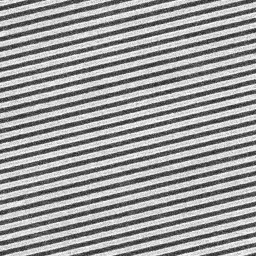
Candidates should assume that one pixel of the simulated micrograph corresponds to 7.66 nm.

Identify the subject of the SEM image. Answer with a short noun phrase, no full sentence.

parallel lines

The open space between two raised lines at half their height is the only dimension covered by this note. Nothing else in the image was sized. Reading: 5.47 px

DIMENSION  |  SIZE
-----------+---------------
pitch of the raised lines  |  76.1 nanometers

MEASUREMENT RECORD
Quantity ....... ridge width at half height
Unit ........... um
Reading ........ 0.0354